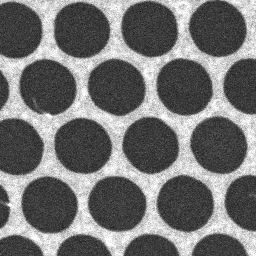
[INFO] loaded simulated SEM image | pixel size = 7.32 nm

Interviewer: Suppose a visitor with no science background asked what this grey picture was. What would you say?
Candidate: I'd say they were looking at a regular array of holes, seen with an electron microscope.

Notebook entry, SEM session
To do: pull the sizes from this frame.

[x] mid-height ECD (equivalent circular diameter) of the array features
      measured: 57.4 pixels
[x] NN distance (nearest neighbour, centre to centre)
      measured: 494 nm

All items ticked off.